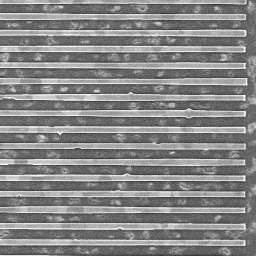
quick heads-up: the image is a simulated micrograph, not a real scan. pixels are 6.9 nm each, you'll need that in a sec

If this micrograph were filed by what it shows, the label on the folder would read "parallel lines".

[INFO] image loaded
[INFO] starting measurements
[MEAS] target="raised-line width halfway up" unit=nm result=38.8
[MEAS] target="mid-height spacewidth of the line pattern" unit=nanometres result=71.6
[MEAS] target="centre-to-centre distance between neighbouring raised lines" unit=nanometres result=111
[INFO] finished